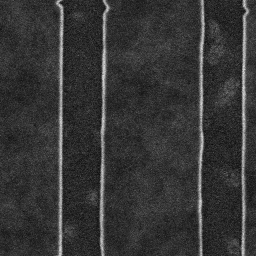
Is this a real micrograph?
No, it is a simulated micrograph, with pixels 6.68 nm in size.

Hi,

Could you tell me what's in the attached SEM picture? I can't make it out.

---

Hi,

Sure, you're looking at one or a few lines or trenches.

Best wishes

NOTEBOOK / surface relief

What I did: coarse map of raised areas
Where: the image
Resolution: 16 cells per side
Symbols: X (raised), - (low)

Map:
XXXX---XXXXXX--X
XXXX---XXXXXX--X
XXXX---XXXXXX--X
XXXX---XXXXXX--X
XXXX---XXXXXX--X
XXXX--XXXXXXX--X
XXXX--XXXXXXX--X
XXXX--XXXXXXX--X
XXXX--XXXXXXX--X
XXXX--XXXXXXX--X
XXXX--XXXXXXX--X
XXXX--XXXXXX---X
XXXX--XXXXXXX--X
XXXX--XXXXXXX--X
XXXX--XXXXXXX--X
XXXX--XXXXXXX--X